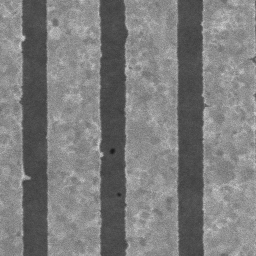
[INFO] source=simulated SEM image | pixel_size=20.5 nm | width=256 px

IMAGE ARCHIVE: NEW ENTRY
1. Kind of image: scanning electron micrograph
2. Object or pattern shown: one or a few lines or trenches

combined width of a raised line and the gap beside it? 1.59 um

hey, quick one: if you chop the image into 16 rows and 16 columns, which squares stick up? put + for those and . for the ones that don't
+..+++..+++..+++
+..+++..+++..+++
+..+++..+++..+++
+..+++..+++..+++
+..+++..+++..+++
+..+++..+++..+++
+..+++..+++..+++
+..+++..+++..+++
+..+++..+++..+++
+..+++..+++..+++
+..+++..+++..+++
+..+++..+++..+++
+..+++..+++..+++
+..+++..+++..+++
+..+++..+++..+++
+..+++..+++..+++